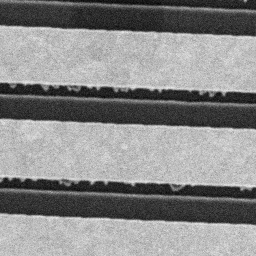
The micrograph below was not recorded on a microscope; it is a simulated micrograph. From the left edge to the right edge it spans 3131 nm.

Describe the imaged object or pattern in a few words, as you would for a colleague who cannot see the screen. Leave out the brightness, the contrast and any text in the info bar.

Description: lines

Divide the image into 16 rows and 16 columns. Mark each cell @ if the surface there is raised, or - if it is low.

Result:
----------------
----------------
@@@@@@@@@@@@@@@@
@@@@@@@@@@@@@@@@
@@@@@@@@@@@@@@@@
---------@@@@@@@
----------------
@---------------
@@@@@@@@@@@@@@@@
@@@@@@@@@@@@@@@@
@@@@@@@@@@@@@@@@
------------@@@@
----------------
@@--------------
@@@@@@@@@@@@@@@@
@@@@@@@@@@@@@@@@